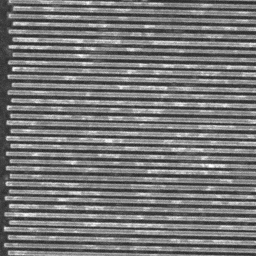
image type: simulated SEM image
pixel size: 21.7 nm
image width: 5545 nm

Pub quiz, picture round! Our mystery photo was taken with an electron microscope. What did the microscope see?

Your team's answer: parallel lines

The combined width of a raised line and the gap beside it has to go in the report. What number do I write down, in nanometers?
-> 165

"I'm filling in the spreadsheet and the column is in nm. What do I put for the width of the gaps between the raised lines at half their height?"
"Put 97.4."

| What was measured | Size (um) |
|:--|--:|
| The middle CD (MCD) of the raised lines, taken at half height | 0.065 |